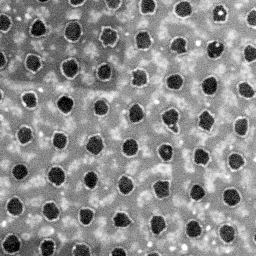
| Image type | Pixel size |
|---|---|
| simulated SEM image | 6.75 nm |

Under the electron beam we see a regular array of raised bodies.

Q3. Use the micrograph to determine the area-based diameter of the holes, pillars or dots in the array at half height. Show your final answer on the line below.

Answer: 124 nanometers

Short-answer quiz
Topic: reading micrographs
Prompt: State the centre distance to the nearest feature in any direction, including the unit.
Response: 236 nanometres